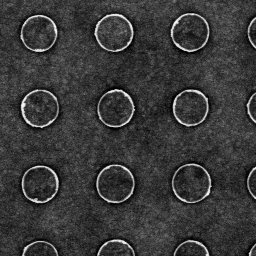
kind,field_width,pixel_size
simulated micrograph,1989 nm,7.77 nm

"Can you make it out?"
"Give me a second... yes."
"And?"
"a regular array of raised bodies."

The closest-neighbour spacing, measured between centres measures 584 nm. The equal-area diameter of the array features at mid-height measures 0.29 micrometres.